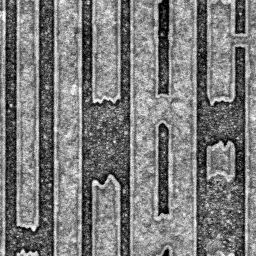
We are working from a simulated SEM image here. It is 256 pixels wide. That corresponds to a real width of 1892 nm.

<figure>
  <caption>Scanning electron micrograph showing parallel lines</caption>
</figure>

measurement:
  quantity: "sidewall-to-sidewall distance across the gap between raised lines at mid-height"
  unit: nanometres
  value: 96.1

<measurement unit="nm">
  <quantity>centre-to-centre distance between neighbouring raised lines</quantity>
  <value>286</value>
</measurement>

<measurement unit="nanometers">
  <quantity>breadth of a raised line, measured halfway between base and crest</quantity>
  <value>185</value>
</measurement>